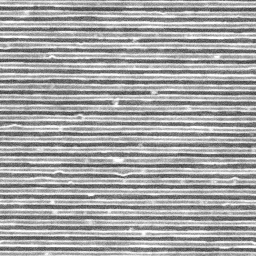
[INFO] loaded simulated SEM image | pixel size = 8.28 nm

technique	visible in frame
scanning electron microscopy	parallel lines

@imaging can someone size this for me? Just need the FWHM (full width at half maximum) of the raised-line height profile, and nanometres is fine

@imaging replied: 41.4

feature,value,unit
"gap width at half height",41.4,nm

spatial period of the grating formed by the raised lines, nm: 86.4